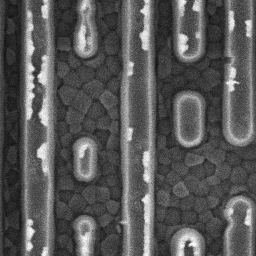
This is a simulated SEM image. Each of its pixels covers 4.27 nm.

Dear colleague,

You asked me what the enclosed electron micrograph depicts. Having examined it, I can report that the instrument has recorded parallel lines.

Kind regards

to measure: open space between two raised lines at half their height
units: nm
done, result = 107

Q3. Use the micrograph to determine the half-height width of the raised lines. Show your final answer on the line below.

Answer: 0.114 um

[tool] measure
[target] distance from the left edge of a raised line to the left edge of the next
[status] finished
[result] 216 nm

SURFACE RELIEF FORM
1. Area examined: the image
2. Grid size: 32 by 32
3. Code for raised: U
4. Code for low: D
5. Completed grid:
DDDUUUDDDDUDDDDDUUUDDDUUUDDDUUUU
DDDUUUDDDDUUDDDDUUUDDDUUUDDDUUUU
DDDUUUDDDDUDDDDDUUUDDDUUUDDDUUUU
DDDUUUDDDDUUDDDDUUUDDDUUUDDDUUUU
DDDUUUDDDDUUDDDDUUUDDDUUUDDDDUUU
DDDUUUDDDDUUDDDDUUUDDDUUUDDDUUUU
DDDUUUDDDDUDDDDDUUUDDDUUUDDDUUUU
DDDUUUDDDDDDDDDDUUUDDDDDDDDDDUUU
DDDUUUDDDDDDDDDDUUUDDDDDDDDDUUUU
DDDUUUDDDDDDDDDDUUUDDDDDDDDDUUUU
DDDUUUDDDDDDDDDDUUUDDDDDDDDDUUUU
DDDUUUDDDDDDDDDDUUUDDDDDDDDDUUUU
DDDUUUDDDDDDDDDUUUUDDDUUUDDDUUUU
DDDUUUDDDDDDDDDUUUUDDDUUUDDDUUUU
DDDUUUDDDDDDDDDDUUUDDDUUUDDDUUUU
DDDUUUDDDDDDDDDDUUUDDDUUUDDDUUUU
DDDUUUDDDDDDDDDUUUUDDDUUUDDDUUUU
DDDUUUDDDDDDDDDUUUUDDDUUUDDDDUUD
DDDUUUDDDUUUDDDUUUUDDDDDDDDDDDDD
DDDUUUDDDUUUDDDUUUUDDDDDDDDDDDDD
DDDUUUDDDDUUDDDDUUUDDDDDDDDDDDDD
DDDUUUDDDDUUDDDDUUUDDDDDDDDDDDDD
DDDUUUDDDDDDDDDDUUUDDDDDDDDDDDDD
DDDUUUDDDDDDDDDDUUUDDDDDDDDDDDDD
DDDUUUDDDDDDDDDDUUUDDDDDDDDDDDDD
DDDUUUDDDDDDDDDDUUUDDDDDDDDDDUUD
DDDUUUDDDDDDDDDDUUUDDDDDDDDDUUUU
DDDUUUDDDDUDDDDUUUUDDDDDDDDDDUUU
DDDUUUDDDDUUDDDDUUUDDDDDDDDDUUUU
DDDUUUDDDDUUDDDDUUUDDDUUUDDDUUUD
DDDUUUDDDDUDDDDDUUUDDDUUUDDDUUUD
DDDUUUDDDDUDDDDDUUUDDDUUUDDDUUUU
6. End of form